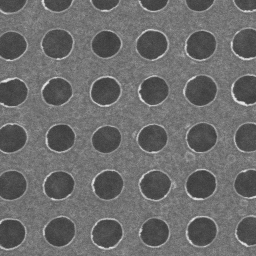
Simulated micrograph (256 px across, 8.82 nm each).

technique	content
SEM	a regular array of holes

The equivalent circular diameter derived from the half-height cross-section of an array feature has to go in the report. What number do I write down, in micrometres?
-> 0.259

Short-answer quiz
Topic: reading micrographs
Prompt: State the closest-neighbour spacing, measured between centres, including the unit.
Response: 0.406 micrometres